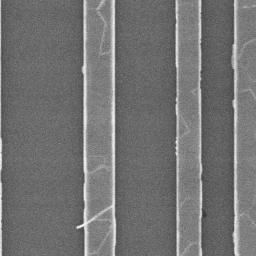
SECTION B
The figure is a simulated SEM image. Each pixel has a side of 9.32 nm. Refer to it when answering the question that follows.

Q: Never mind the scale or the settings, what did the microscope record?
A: lines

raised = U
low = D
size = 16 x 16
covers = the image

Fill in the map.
DDDDDUUDDDDUUDDU
DDDDDUUDDDDUUDDU
DDDDDUUDDDDUUDDU
DDDDDUUDDDDUUDDU
DDDDDUUDDDDUUDDU
DDDDDUUDDDDUUDDU
DDDDDUUDDDDUUDDU
DDDDDUUDDDDUUDDU
DDDDDUUDDDDUUDDU
DDDDDUUDDDDUUDDU
DDDDDUUDDDDUUDDU
DDDDDUUDDDDUUDDU
DDDDDUUDDDDUUDDU
DDDDDUUDDDDUUDDU
DDDDDUUDDDDUUDDU
DDDDDUUDDDDUUDDU